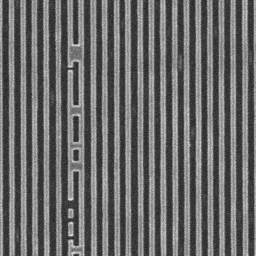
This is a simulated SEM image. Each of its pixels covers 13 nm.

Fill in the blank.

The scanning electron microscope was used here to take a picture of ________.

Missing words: parallel lines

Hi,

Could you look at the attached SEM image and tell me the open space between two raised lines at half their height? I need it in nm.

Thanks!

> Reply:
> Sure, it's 105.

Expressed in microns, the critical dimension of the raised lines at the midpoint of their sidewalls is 0.047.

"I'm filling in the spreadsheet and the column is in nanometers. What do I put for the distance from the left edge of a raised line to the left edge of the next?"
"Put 151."